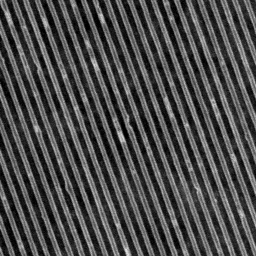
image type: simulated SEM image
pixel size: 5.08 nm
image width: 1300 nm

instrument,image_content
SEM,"parallel lines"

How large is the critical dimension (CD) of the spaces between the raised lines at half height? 33.5 nanometres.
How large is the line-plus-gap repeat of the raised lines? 55.5 nanometres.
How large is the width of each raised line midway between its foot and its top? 4.7 pixels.